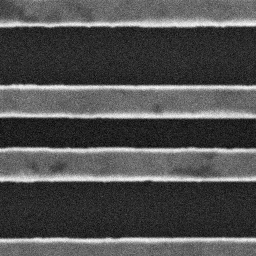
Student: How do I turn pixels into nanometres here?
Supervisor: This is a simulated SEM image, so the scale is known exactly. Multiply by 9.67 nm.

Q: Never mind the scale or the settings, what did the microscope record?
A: lines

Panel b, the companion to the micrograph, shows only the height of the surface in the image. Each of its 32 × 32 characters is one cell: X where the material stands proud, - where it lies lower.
XXXXXXXXXXXXXXXXXXXXXXXXXXXXXXXX
XXXXXXXXXXXXXXXXXXXXXXXXXXXXXXXX
XXXXXXXXXXXXXXXXXXXXXXXXXXXXXXXX
--------------------------------
--------------------------------
--------------------------------
--------------------------------
--------------------------------
--------------------------------
--------------------------------
--------------------------------
XXXXXXXXXXXXXXXXXXXXXXXXXXXXXXXX
XXXXXXXXXXXXXXXXXXXXXXXXXXXXXXXX
XXXXXXXXXXXXXXXXXXXXXXXXXXXXXXXX
XXXXXXXXXXXXXXXXXXXXXXXXXXXXXXXX
--------------------------------
--------------------------------
--------------------------------
--------------------------------
XXXXXXXXXXXXXXXXXXXXXXXXXXXXXXXX
XXXXXXXXXXXXXXXXXXXXXXXXXXXXXXXX
XXXXXXXXXXXXXXXXXXXXXXXXXXXXXXXX
XXXXX-XX-X-XXXXXXX-XXXXXXXXXXXXX
--------------------------------
--------------------------------
--------------------------------
--------------------------------
--------------------------------
--------------------------------
--------------------------------
XXXXXXXXXXXXXXXXXXXXXXXXXXXXXXXX
XXXXXXXXXXXXXXXXXXXXXXXXXXXXXXXX